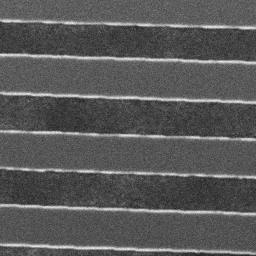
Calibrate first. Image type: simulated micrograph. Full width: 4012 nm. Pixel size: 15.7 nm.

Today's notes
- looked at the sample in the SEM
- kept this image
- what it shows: lines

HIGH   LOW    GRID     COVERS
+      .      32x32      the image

++++++++++++++++++++++++++++++++
++++++++++++++++++++++++++++++++
++++++++++++++++++++++++++++++++
.............................+++
................................
................................
................................
+++++++++++++++++++++...........
++++++++++++++++++++++++++++++++
++++++++++++++++++++++++++++++++
++++++++++++++++++++++++++++++++
++++++++++++++++++++++++++++++++
......................++++++++++
................................
................................
................................
+++.............................
++++++++++++++++++++++++++++++++
++++++++++++++++++++++++++++++++
++++++++++++++++++++++++++++++++
++++++++++++++++++++++++++++++++
............++++++++++++++++++++
................................
................................
................................
................................
++++++++++++++++++++++++++......
++++++++++++++++++++++++++++++++
++++++++++++++++++++++++++++++++
++++++++++++++++++++++++++++++++
++++++++++++++++++++++++++++++++
..........................++++++